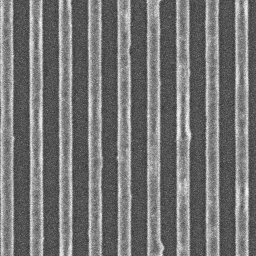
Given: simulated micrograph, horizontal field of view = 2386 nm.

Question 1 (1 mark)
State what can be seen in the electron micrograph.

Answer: parallel lines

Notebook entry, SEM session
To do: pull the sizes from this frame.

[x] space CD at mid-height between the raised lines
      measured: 164 nanometres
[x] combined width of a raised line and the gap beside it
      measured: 0.274 micrometres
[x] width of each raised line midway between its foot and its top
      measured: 12 pixels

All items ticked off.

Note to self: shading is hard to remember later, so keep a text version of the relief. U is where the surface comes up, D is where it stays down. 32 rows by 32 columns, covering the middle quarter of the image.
UUDDDDUUUDDDDDUUDDDDDUUUDDDDUUUD
UUDDDDUUUDDDDDUUDDDDDUUUDDDDUUUD
UUDDDDUUUDDDDDUUDDDDDUUUDDDDUUUD
UUDDDDUUUDDDDDUUDDDDDUUUDDDDUUUD
UUDDDDUUUDDDDDUUDDDDDUUUDDDDUUUD
UUDDDDUUUDDDDDUUDDDDDUUUDDDDUUUD
UUDDDDUUUDDDDDUUDDDDDUUUDDDDUUUD
UUDDDDUUUDDDDDUUDDDDDUUUDDDDUUUD
UUDDDDUUUDDDDDUUDDDDDUUUDDDDUUUD
UUDDDDUUUDDDDDUUDDDDDUUUDDDDUUUD
UUDDDDUUUDDDDDUUDDDDDUUUDDDDUUUD
UUDDDDUUUDDDDDUUDDDDDUUUDDDDUUUD
UUDDDDUUUDDDDDUUDDDDDUUUDDDDUUUD
UUDDDDUUUDDDDDUUDDDDDUUUDDDDUUUD
UUDDDDUUUDDDDDUUDDDDDUUUDDDDUUUD
UUDDDDUUUDDDDDUUDDDDDUUUDDDDUDDD
UUDDDDUUUDDDDDUUDDDDDUUUDDDDUDDD
UUDDDDUUUDDDDDUUDDDDDUUUDDDDUDDD
UUDDDDUUUDDDDDUUDDDDDUUUDDDDUUUD
UUDDDDUUUDDDDDUUDDDDDUUUDDDDUUUD
UUDDDDUUUDDDDDUUDDDDDUUUDDDDUUUD
UUDDDDUUUDDDDDUUDDDDDUUUDDDDUUUD
UUDDDDUUUDDDDDUUDDDDDUUUDDDDUUUD
UUDDDDUUUDDDDUUUDDDDDUUUDDDDUUUD
UUDDDDUUUDDDDDUUDDDDDUUUDDDDUUUD
UUDDDDUUUDDDDDUUDDDDDUUUDDDDUUUD
UUDDDDUUUDDDDDUUDDDDDUUUDDDDUUUD
UUDDDDUUUDDDDDUUDDDDDUUUDDDDUUUD
UUDDDDUUUDDDDDUUDDDDDUUUDDDDUUUD
UUDDDDUUUDDDDDUUDDDDDUUUDDDDUUUD
UUDDDDUUUDDDDDUUDDDDDUUUDDDDUUUD
UUDDDDUUUDDDDDUUDDDDDUUUDDDDUUUD